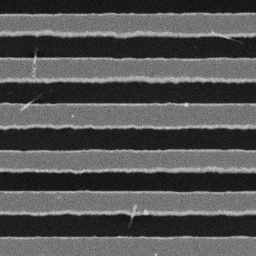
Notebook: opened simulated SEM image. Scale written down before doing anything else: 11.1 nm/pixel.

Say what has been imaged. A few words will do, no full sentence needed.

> lines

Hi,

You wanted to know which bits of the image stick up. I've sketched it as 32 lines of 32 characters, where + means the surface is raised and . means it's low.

................................
................................
++++++++++++++++++++++++++++++++
++++++++++++++++++++++++++++++++
++..+.++++++++++++++++++++++++++
................................
................................
++++++++++++++++++++++++++++++++
++++++++++++++++++++++++++++++++
++++++++++++++++++++++++++++++++
................................
................................
................................
++++++++++++++++++++++++++++++++
++++++++++++++++++++++++++++++++
++++++++++++++++++++++++++++++++
................................
................................
................................
++++++++++++++++++++++++++++++++
++++++++++++++++++++++++++++++++
.++.+++++++++..++.++.+++++.+++++
................................
................................
++++++++++++++++++++++++++++++++
++++++++++++++++++++++++++++++++
++++++++++++++++++++++++++++++++
................................
................................
................................
++++++++++++++++++++++++++++++++
++++++++++++++++++++++++++++++++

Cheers